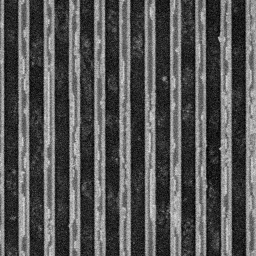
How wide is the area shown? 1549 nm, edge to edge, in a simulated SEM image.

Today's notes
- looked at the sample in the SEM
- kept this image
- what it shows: parallel lines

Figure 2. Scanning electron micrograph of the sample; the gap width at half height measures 103 nm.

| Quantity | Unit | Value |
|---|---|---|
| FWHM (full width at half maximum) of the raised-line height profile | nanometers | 48.4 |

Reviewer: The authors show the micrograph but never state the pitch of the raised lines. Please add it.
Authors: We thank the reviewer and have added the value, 153 nm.